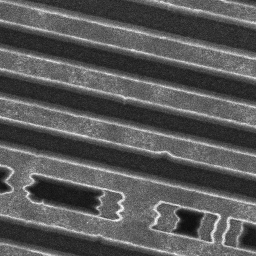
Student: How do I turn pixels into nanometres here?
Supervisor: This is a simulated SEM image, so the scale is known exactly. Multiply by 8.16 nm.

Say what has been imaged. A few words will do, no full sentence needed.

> parallel lines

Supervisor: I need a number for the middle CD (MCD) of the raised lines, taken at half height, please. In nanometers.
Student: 202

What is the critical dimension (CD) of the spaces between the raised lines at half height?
186 nanometers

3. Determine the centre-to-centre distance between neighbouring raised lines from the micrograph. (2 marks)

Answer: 388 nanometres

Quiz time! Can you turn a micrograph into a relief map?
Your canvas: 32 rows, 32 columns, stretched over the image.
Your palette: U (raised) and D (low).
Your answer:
UUUUDDDDDDDDDDDDDDDUUUUUUUUUUUUU
UUUUUUUUDDDDDDDDDDDDDDDDUUUUUUUU
UUUUUUUUUUUUDDDDDDDDDDDDDDDDDUUU
DDUUUUUUUUUUUUUUUDDDDDDDDDDDDDDD
DDDDDDDUUUUUUUUUUUUUUDDDDDDDDDDD
DDDDDDDDDDDUUUUUUUUUUUUUUUDDDDDD
UUUDDDDDDDDDDDDDUUUUUUUUUUUUUUDD
UUUUUUUUDDDDDDDDDDDDUUUUUUUUUUUU
UUUUUUUUUUUUDDDDDDDDDDDDUUUUUUUU
DDUUUUUUUUUUUUUUDDDDDDDDDDDDDUUU
DDDDDDDUUUUUUUUUUUUUUDDDDDDDDDDD
DDDDDDDDDDDUUUUUUUUUUUUUUDDDDDDD
UUUDDDDDDDDDDDDUUUUUUUUUUUUUUUDD
UUUUUUUDDDDDDDDDDDDDUUUUUUUUUUUU
UUUUUUUUUUUUDDDDDDDDDDDDUUUUUUUU
DDUUUUUUUUUUUUUUDDDDDDDDDDDDDUUU
DDDDDDUUUUUUUUUUUUUUDDDDDDDDDDDD
DDDDDDDDDDDUUUUUUUUUUUUUUDDDDDDD
UUDDDDDDDDDDDDDUUUUUUUUUUUUUUDDD
UUUUUUUDDDDDDDDDDDDDDUUUUUUUUUUU
UUUUUUUUUUUDDDDDDDDDDDDDUUUUUUUU
DUUUUUUUUUUUUUUUDDDDDDDDDDDDDUUU
DUUUDDUUUUUUUUUUUUUUDDDDDDDDDDDD
DUUUDDDDDDDUUUUUUUUUUUUUUDDDDDDD
UUUUDDDDDDDDUUUUUUUUUUUUUUUUUDDD
UUUUUUUDDDDDUUUUUUUUUUUUUUUUUUUU
UUUUUUUUUUUDUUUUUUUUUUDDUUUUUUUU
DUUUUUUUUUUUUUUUUUUUUUUDDUUUUUUU
DDDDDDUUUUUUUUUUUUUUUUDDDUUUUUUD
DDDDDDDDDDUUUUUUUUUUUUUUUUUUUUDD
UUDDDDDDDDDDDDDUUUUUUUUUUUUUUUDD
UUUUUUDDDDDDDDDDDDDUUUUUUUUUUUUU